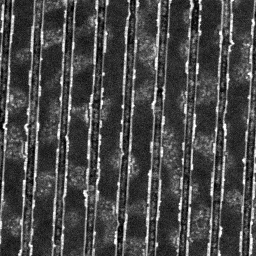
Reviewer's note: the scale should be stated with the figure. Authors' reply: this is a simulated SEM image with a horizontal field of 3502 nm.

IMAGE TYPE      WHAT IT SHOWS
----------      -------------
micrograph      parallel lines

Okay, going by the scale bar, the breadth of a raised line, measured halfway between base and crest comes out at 316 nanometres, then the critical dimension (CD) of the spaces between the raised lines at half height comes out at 7.74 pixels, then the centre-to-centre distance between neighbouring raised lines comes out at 428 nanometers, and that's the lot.